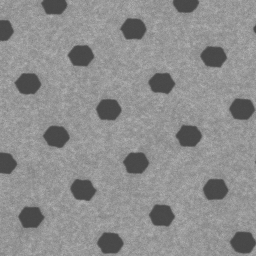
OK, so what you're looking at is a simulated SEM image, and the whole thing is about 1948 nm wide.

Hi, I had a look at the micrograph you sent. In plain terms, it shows a regular array of holes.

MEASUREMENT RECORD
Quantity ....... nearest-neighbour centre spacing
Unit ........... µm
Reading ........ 0.447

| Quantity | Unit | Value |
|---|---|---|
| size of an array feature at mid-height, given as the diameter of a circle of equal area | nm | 178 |